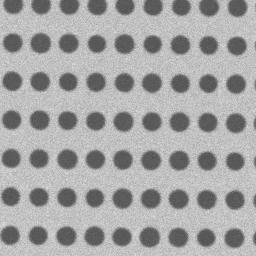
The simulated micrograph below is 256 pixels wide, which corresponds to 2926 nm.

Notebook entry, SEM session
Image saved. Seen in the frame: a regular array of holes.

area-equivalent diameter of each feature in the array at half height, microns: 0.225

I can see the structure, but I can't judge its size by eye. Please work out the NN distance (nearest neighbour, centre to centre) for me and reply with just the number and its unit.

318 nm